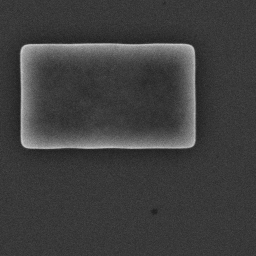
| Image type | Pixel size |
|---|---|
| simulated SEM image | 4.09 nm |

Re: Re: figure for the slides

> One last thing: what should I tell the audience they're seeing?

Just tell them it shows wiring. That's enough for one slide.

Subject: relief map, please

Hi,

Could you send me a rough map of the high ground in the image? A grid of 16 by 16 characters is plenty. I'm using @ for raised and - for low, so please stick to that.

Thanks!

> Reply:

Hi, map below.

----------------
----------------
----------------
-@@@@@@@@@@@----
-@@@@@@@@@@@----
-@@@@@@@@@@@----
-@@@@@@@@@@@----
-@@@@@@@@@@@----
-@@@@@@@@@@@----
----------------
----------------
----------------
----------------
----------------
----------------
----------------